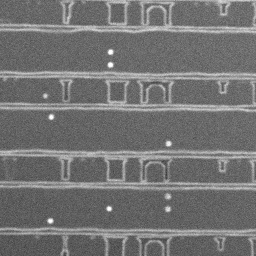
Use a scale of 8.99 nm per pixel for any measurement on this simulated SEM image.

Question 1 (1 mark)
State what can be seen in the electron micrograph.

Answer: wiring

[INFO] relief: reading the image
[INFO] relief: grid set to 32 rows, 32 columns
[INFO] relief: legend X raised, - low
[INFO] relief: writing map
--------------------------------
--------------------------------
--------------------------------
XXXXXXXXXXXXXXX------XXXXX------
XXXXXXXXXXXXXXXXXXXXXXXXXXXXXXXX
XXXXXXXXXXXXXXXXXXXXXXXXXXXXXXXX
XXXXXXXXXXXXXXXXXXXXXXXXXXXXXXXX
XXXXXXXXXXXXXXXXXXXXXXXXXXXXXXXX
XXXXXXXXXXXXXXXXXXXXXXXXXXXXXXXX
XXXXXXXX-XXXXXXXXXXXXXXXXXXXXXXX
--------------------------------
--------------------------------
--------------------------------
XXXXXXXXXXXXXXXXXXXXXXXXXXXXXXXX
XXXXXXXXXXXXXXXXXXXXXXXXXXXXXXXX
XXXXXXXXXXXXXXXXXXXXXXXXXXXXXXXX
XXXXXXXXXXXXXXXXXXXXXXXXXXXXXXXX
XXXXXXXXXXXXXXXXXXXXXXXXXXXXXXXX
XXXXXXXXXXXXXXXXXXXXXXXXXXXXXXXX
--------------------XXXXXXXXXXXX
--------------------------------
--------------------------------
--------------------------------
XXXXXXXXXXXXXXXXXXXXXXXXXXXXXXXX
XXXXXXXXXXXXXXXXXXXXXXXXXXXXXXXX
XXXXXXXXXXXXXXXXXXXXXXXXXXXXXXXX
XXXXXXXXXXXXXXXXXXXXXXXXXXXXXXXX
XXXXXXXXXXXXXXXXXXXXXXXXXXXXXXXX
XXXXXXXXXXXXXXXXXXXXXXXXXXXXXXXX
--------------------------------
--------------------------------
--------------------------------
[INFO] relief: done